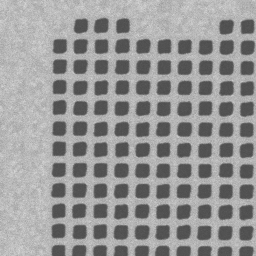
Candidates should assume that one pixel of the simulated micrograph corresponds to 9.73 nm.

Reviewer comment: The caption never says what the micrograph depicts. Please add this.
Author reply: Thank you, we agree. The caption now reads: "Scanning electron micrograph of a regular array of holes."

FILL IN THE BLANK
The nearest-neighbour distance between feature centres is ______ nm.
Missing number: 199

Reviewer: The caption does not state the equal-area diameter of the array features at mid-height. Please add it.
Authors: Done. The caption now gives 151 nanometers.